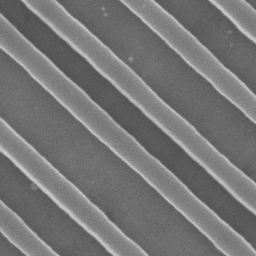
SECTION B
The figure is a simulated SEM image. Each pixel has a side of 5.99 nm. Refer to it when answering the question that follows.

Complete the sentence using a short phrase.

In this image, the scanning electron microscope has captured lines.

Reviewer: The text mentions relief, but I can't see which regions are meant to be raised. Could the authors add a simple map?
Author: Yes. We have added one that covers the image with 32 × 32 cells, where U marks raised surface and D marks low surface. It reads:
DDDUUUUDDDDDDDDDUUUUDDDDDDDUUUUD
DDDDUUUUDDDDDDDDDUUUUDDDDDDDUUUU
UDDDDUUUUUDDDDDDDDUUUUDDDDDDDUUU
UUDDDDUUUUUDDDDDDDDUUUUDDDDDDDUU
UUUDDDDUUUUUDDDDDDDDUUUUDDDDDDDU
UUUUDDDDDUUUUDDDDDDDDUUUUDDDDDDD
DUUUUDDDDDUUUUDDDDDDDDUUUUDDDDDD
DDUUUUDDDDDUUUUDDDDDDDDUUUUDDDDD
DDDUUUUDDDDDUUUUDDDDDDDDUUUUDDDD
DDDDUUUUDDDDDUUUUDDDDDDDDUUUUUDD
DDDDDUUUUDDDDDUUUUDDDDDDDDUUUUDD
DDDDDDUUUUUDDDDUUUUDDDDDDDDUUUUU
DDDDDDDUUUUDDDDDUUUUDDDDDDDDDUUU
DDDDDDDDUUUUUDDDDUUUUDDDDDDDDDUU
DDDDDDDDDUUUUUDDDDUUUUUDDDDDDDDU
UDDDDDDDDDUUUUUDDDDUUUUUDDDDDDDD
UUDDDDDDDDDUUUUUDDDDDUUUUDDDDDDD
UUUDDDDDDDDDUUUUUDDDDDUUUUDDDDDD
UUUUDDDDDDDDDDUUUUDDDDDUUUUDDDDD
DUUUUDDDDDDDDDDUUUUDDDDDUUUUDDDD
DDUUUUDDDDDDDDDDUUUUDDDDDUUUUDDD
DDDUUUUDDDDDDDDDDUUUUDDDDDUUUUDD
DDDDUUUUDDDDDDDDDDUUUUDDDDDUUUUD
DDDDDUUUUUDDDDDDDDDUUUUDDDDDUUUU
DDDDDDUUUUUDDDDDDDDDUUUUDDDDDUUU
UDDDDDDUUUUUDDDDDDDDDUUUUUDDDDUU
UUDDDDDDUUUUUDDDDDDDDDUUUUUDDDDU
UUUDDDDDDUUUUUDDDDDDDDDDUUUUDDDD
UUUUDDDDDDUUUUUDDDDDDDDDDUUUUDDD
DUUUUDDDDDDDUUUUDDDDDDDDDDUUUUDD
DDUUUUDDDDDDDUUUUDDDDDDDDDDUUUUD
DDDUUUUDDDDDDDUUUUDDDDDDDDDDUUUU